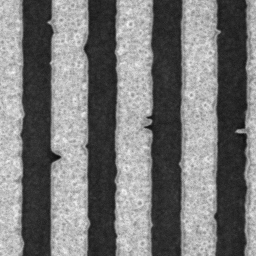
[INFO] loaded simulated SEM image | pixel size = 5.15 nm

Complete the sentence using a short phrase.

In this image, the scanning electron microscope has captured one or a few lines or trenches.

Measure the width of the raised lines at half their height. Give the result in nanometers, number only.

182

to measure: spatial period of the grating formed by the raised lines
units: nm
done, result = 333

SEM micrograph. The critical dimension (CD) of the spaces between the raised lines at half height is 29.9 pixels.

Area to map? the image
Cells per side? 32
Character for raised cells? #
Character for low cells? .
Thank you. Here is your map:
###....####....####....####....#
###....####....####....####....#
###...#####....####....####....#
###....####....####....####....#
###....####....####....####....#
###....####....####....####....#
###....####...#####....####....#
###...#####....####....####....#
###...#####....####....####....#
###....####....####....####....#
###...#####....####....####....#
###....####....####....####....#
###....####....####....####....#
###...#####....####....####....#
###....####...#####....####....#
###...#####....####....####....#
###...#####...#####....####...##
###...#####...#####....####....#
###...#####...#####....####....#
###....####...#####....####....#
###....####...#####....####....#
###...#####....####....####....#
###....####...#####....####....#
###....####....####....####....#
###...#####...#####....####....#
###...#####...#####....####....#
###...#####...#####....####....#
###...#####...#####....####....#
###...#####...#####....####....#
###...#####....####....####....#
###...#####....####....####....#
###...#####....####....####....#